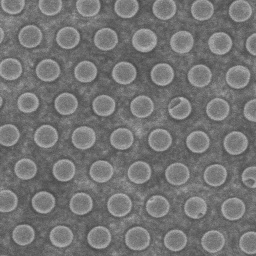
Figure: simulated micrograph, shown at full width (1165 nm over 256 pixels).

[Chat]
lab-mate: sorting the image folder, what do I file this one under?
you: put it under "a regular array of raised bodies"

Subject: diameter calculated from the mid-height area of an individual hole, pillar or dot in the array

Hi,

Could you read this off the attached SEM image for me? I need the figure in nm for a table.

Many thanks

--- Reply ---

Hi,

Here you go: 101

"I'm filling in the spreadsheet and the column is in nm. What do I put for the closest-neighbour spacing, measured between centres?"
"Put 172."